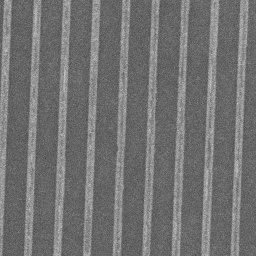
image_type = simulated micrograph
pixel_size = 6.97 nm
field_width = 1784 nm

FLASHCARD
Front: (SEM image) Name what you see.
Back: parallel lines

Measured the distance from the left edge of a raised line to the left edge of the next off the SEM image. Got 206 nm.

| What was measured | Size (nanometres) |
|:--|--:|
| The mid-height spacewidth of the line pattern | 159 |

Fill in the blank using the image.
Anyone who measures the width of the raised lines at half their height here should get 46.1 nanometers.